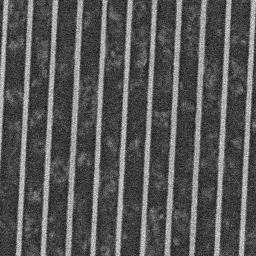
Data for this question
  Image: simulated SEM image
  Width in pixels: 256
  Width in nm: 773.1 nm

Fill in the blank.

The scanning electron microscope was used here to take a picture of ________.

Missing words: parallel lines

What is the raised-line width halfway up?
13.9 nanometers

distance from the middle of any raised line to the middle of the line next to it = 74.6 nm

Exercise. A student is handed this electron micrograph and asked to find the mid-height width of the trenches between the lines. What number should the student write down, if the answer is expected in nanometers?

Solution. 62.5